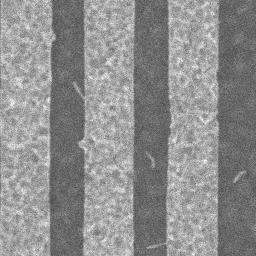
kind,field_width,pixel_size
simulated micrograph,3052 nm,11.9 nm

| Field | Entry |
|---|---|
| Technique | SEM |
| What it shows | one or a few lines or trenches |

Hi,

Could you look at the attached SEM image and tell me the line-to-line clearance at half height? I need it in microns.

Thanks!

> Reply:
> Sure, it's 0.423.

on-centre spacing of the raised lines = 1000 nm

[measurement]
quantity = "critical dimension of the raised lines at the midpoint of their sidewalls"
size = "575 nm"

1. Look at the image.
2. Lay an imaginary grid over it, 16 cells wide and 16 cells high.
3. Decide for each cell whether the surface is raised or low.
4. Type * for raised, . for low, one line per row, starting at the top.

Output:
***..***...***..
***..***...***..
***..***...***..
***..***...***..
***..***...***..
***..***...***..
***..***...***..
***..***...***..
***..***...***..
***..***...***..
***..***...***..
***..***..****..
***..***..****..
***..***..****..
***..***..****..
***..***..****..